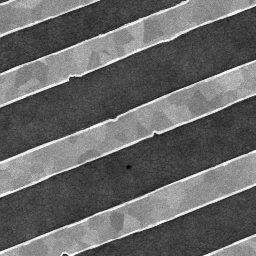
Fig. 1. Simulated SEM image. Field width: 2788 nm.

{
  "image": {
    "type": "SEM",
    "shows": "one or a few lines or trenches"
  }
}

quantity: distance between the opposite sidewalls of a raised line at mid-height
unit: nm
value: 336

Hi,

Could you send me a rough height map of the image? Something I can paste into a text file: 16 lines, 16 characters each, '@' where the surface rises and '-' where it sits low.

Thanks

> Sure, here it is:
@@@@@------@@@@@
@@------@@@@@---
------@@@@@-----
---@@@@@--------
@@@@@@--------@@
@@@---------@@@@
---------@@@@@--
-------@@@@@----
----@@@@@-------
--@@@@@---------
@@@@---------@@@
@@---------@@@@@
--------@@@@@@--
------@@@@@-----
---@@@@@--------
-@@@@@--------@@